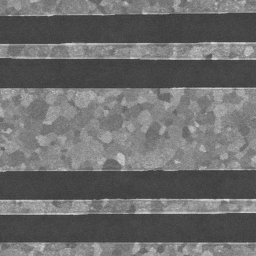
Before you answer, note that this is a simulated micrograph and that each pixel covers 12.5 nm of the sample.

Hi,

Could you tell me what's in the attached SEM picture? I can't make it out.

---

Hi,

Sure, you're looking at lines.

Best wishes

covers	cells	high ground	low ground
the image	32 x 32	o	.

oooooooooooooooooooooooooooooooo
ooooooooooooooooooooooooooooo...
................................
................................
................................
........oooooooooooooooooooooooo
oooooooooooooooooooooooooooooooo
................................
................................
................................
................................
oooooooooooooooooooooooooooooooo
oooooooooooooooooooooooooooooooo
oooooooooooooooooooooooooooooooo
oooooooooooooooooooooooooooooooo
oooooooooooooooooooooooooooooooo
oooooooooooooooooooooooooooooooo
oooooooooooooooooooooooooooooooo
oooooooooooooooooooooooooooooooo
oooooooooooooooooooooooooooooooo
oooooooooooooooooooooooooooooooo
................................
................................
................................
................................
oooooooooooooooooooooooooooooooo
oooooooooooooooooooooooooooooooo
................................
................................
................................
oooooooooooooooooooooooooooooooo
oooooooooooooooooooooooooooooooo